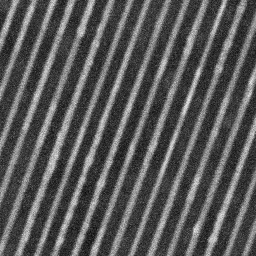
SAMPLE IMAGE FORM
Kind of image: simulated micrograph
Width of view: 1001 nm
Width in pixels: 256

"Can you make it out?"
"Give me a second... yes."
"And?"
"parallel lines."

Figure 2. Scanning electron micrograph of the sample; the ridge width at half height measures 18.3 nm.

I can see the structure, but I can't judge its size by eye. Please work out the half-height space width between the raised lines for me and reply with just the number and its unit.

51.4 nm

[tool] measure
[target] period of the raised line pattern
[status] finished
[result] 0.0698 µm